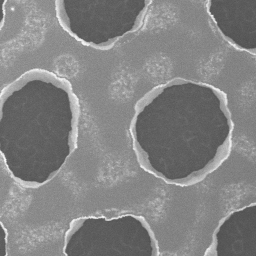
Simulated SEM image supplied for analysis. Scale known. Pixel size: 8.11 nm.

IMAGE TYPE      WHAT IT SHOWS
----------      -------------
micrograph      holes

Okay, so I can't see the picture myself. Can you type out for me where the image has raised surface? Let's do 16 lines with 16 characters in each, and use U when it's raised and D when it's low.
UUUUDDDDDUUUUDDD
UUUUDDDDDUUUUUDD
UUUUUDDUUUUUUUDD
UUUUUUUUUUUUUUUU
UUUUUUUUUUUUUUUU
UDDDUUUUUUDDDUUU
DDDDUUUUUDDDDDUU
DDDDDUUUUDDDDDUU
DDDDUUUUDDDDDDUU
DDDDUUUUUDDDDDUU
UDDDUUUUUDDDDUUU
UUUUUUUUUUUUUUUU
UUUUUUUUUUUUUUUU
UUUUUUUUUUUUUUDD
UUUUUDDDDUUUUUDD
UUUUDDDDDDUUUUDD